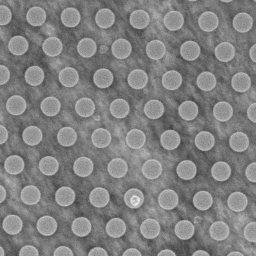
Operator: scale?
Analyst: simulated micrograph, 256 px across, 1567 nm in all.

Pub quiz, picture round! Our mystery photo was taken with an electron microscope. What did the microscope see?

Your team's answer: an array of small figures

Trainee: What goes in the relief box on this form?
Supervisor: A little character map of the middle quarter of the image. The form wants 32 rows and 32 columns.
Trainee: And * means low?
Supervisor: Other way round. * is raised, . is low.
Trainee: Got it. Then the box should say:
................................
***......**.......*.............
***.....****....*****....****...
***....*****....*****....****...
***.....****....*****....****...
**......***......***.....****...
................................
................................
................................
...****.....****.....***......**
...*****....****....*****....***
...*****....****....*****....***
....***.....****....*****....***
......................*.......**
................................
................................
**......**.......**.............
***....****.....****.....****...
***....*****....****....*****...
***....****.....****....*****...
........***.....***......***....
................................
................................
....**..........................
...****.....***......***.....***
..*****....*****....****.....***
...****....*****....****....****
...***......***.....****....****
.....................**......***
................................
................................
**.....***......***.......*.....